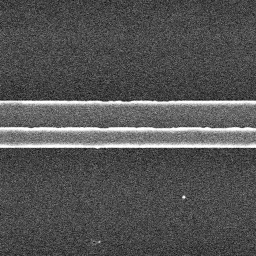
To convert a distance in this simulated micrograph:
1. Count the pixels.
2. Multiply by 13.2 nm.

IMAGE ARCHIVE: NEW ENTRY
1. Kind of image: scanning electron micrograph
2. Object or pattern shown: lines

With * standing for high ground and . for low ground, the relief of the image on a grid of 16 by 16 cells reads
................
................
................
................
................
................
****************
****************
****************
................
................
................
................
................
................
................